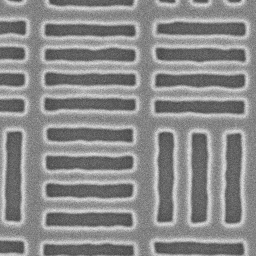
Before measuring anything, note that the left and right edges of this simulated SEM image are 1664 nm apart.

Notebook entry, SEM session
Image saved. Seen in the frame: groups of lines, slits or small figures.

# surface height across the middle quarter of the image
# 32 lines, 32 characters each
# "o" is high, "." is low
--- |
oooooooooooooooooooooooooooooooo
oooooooooooooooooooooooooooooooo
..................ooooo.........
..................ooooo.........
..................ooooo.........
..................ooooo.........
oooooooooooooooooooooooooooooooo
oooooooooooooooooooooooooooooooo
...............ooooooooooooooooo
..................ooooo.........
..................oooo..........
..................oooo..........
ooooooooooooooooooooooo.......oo
oooooooooooooooooooooooooooooooo
oooooooooooooooooooooooooooooooo
oooooooooooooooooooooooooooooooo
.................ooooooooooooooo
..................ooooo....ooooo
..................ooooo.....oooo
...oo............oooooo.....oooo
ooooooooooooooooooooooo.....oooo
ooooooooooooooooooooooo.....oooo
ooooooooooooooooooooooo.....oooo
..................ooooo.....oooo
..................ooooo.....oooo
..................ooooo.....oooo
.................oooooo.....oooo
ooooooooooooooooooooooo.....oooo
ooooooooooooooooooooooo.....oooo
ooooooooooooooooooooooo.....oooo
..................ooooo.....oooo
..................ooooo.....oooo